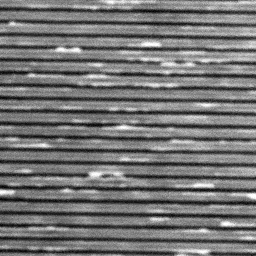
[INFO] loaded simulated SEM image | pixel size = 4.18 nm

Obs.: parallel lines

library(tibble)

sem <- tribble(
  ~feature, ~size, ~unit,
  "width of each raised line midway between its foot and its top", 32.9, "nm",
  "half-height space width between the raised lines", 0.022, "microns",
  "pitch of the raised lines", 12.8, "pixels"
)